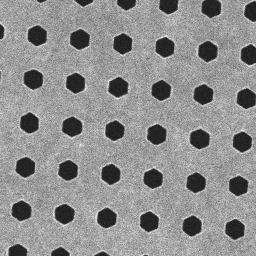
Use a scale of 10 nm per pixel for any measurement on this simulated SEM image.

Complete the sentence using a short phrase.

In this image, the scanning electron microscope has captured a regular array of holes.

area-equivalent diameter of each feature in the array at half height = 197 nanometers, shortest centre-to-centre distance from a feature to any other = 427 nanometres